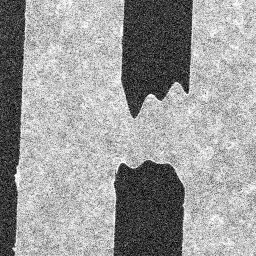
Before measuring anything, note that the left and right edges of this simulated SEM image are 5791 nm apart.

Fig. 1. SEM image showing one or a few lines or trenches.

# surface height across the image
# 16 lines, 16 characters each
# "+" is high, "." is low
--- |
..++++++....++++
..++++++....++++
..++++++....++++
..++++++....++++
.+++++++....++++
.+++++++....++++
.+++++++.+++++++
.+++++++++++++++
.+++++++++++++++
.+++++++++++++++
.++++++....+++++
.++++++....+++++
.++++++.....++++
.++++++.....++++
.++++++....+++++
.++++++....+++++